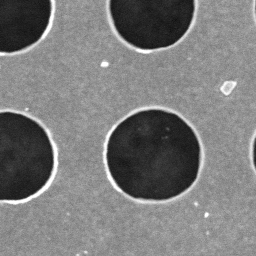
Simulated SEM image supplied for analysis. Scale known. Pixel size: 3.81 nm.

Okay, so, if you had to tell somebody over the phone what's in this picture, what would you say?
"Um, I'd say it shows holes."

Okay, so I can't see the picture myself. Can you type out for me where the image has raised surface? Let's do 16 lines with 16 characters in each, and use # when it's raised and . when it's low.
...####.....####
...####.....####
..######...#####
################
################
################
################
..######...#####
...####.....####
...####......###
...####.....####
...####.....####
.########.######
################
################
################